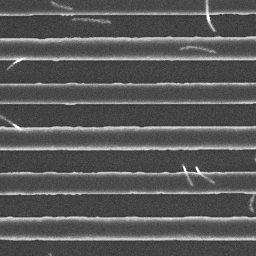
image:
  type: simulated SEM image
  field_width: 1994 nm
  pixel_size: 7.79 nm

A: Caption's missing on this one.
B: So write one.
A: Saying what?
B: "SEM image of lines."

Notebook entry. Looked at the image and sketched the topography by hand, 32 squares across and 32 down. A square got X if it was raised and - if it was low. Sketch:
XXXXXXXXXXXXXXXXXXXXXXXXXXXXXXXX
XXXXXXXXXXXXXXXXXXXXXXXXXXXXXXXX
--------------------------------
--------------------------------
--------------------------------
XXXXXXXXXXXXXXXXXXXXXXXXXXXXXXXX
XXXXXXXXXXXXXXXXXXXXXXXXXXXXXXXX
--X-----------------------------
--------------------------------
--------------------------------
----XX--XX----XXX--XXXXXXXXXXXXX
XXXXXXXXXXXXXXXXXXXXXXXXXXXXXXXX
XXXXXXXXXXXXXXXXXXXXXXXXXXXXXXXX
--------------------------------
--------------------------------
--------------------------------
XXXXXXXXXXXXXXXXXXXXXXXXXXXXXXXX
XXXXXXXXXXXXXXXXXXXXXXXXXXXXXXXX
XXXXXXXXXXXXXXXXXXXXXXXXXXXXXXXX
--------------------------------
--------------------------------
-----------------------XX-------
XXXXXXXXXXXXXXXXXXXXXXXXXXXXXXXX
XXXXXXXXXXXXXXXXXXXXXXXXXXXXXXXX
--------------------------------
--------------------------------
--------------------------------
XXXXXXXXXXXXXXXXXXXXXXXXXXXXXXXX
XXXXXXXXXXXXXXXXXXXXXXXXXXXXXXXX
XXXXXXXXXXXXXXXXXXXXXXXXXXXXXXXX
--------------------------------
--------------------------------